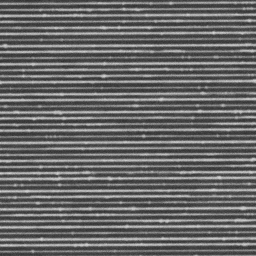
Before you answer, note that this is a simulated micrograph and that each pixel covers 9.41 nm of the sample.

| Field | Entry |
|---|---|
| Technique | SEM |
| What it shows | parallel lines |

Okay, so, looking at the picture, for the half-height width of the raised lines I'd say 17.6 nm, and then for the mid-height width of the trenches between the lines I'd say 0.0447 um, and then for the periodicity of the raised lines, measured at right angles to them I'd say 56.8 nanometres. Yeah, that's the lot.